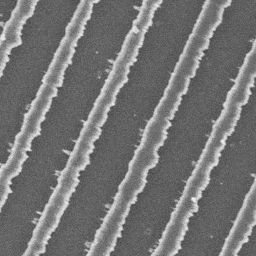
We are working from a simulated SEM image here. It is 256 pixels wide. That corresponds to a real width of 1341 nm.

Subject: lines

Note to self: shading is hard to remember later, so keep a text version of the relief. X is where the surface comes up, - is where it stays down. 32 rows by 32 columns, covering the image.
--XX------XX------XX------XXX---
--XX-----XX------XX------XXX----
-XX------XX------XX------XXX----
-XX-----XX-------XX-----XXX-----
XX------XX------XX------XX------
XX------X------XXX-----XXX------
X------XX------XX------XX------X
X------XX------XX-----XXX------X
------XX------XX------XXX-----XX
------XX------XX-----XXX------XX
-----XXX-----XXX-----XXX-----XXX
-----XX------XX------XX------XX-
----XX------XX------XXX-----XXX-
----XX------XX------XX------XX--
---XXX-----XX------XXX------XX--
---XX------XX-----XXX------XX---
--XXX-----XXX-----XXX-----XXX---
--XX------XX------XXX-----XX----
--XX-----XXX-----XXX------XX----
-XX------XX------XXX-----XX-----
-XX-----XXX-----XXXX-----XX-----
XX------XX------XX------XX------
X------XXX-----XXX------XX------
X------XX------XXX-----XXX-----X
X-----XXX-----XXX------XX------X
------XX------XX------XXX-----XX
-----XXX------XX------XX------XX
-----XX------XXX-----XX------XXX
----XXX-----XXX------XX------XXX
----XX------XXX-----XXX-----XXX-
----XX------XX------XXX-----XX--
---XX------XXX-----XXX------XX--